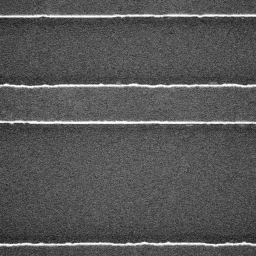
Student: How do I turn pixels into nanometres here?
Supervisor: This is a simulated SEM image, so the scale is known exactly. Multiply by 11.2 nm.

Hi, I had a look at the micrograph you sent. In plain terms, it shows lines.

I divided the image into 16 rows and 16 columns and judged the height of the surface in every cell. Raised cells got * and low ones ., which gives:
****************
................
................
................
................
****************
****************
****************
................
................
................
................
................
................
................
****************